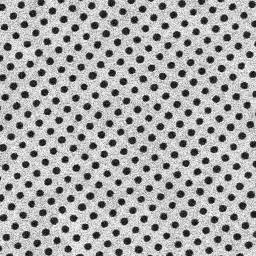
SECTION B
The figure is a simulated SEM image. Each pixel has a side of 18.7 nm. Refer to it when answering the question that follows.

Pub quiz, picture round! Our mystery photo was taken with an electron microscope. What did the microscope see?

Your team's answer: a regular array of holes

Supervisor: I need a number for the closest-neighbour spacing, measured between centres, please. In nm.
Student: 257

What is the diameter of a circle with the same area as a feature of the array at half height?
147 nm